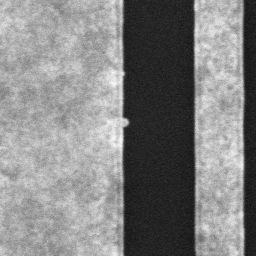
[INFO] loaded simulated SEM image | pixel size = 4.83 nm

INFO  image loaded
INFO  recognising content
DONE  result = wiring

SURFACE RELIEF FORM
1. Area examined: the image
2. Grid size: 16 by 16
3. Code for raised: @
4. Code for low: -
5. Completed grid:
@@@@@@@@----@@@-
@@@@@@@@----@@@-
@@@@@@@@----@@@-
@@@@@@@@----@@@-
@@@@@@@@----@@@-
@@@@@@@@----@@@-
@@@@@@@@----@@@-
@@@@@@@@----@@@-
@@@@@@@@----@@@-
@@@@@@@@----@@@-
@@@@@@@@----@@@-
@@@@@@@@----@@@-
@@@@@@@@----@@@-
@@@@@@@@----@@@-
@@@@@@@@----@@@-
@@@@@@@@----@@@-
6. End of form